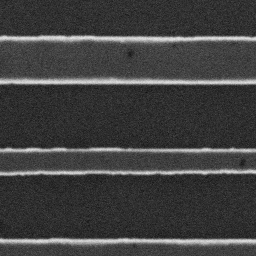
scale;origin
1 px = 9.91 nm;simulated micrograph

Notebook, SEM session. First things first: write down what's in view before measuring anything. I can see lines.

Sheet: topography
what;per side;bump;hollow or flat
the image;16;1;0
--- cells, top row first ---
0000000000000000
0000000000000000
1111111111111111
1111111111111111
1111111111111111
0000000000000000
0000000000000000
0000000000000000
0000000000000000
1111111111111111
1111111111111111
0000000000000000
0000000000000000
0000000000000000
0000000000000000
1111111111111111